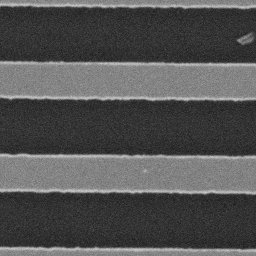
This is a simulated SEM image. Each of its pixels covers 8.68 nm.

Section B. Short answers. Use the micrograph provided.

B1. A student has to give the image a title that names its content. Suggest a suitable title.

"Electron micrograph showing lines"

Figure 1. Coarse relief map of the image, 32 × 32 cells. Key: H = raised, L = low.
HHHHHHHHHHHHHHHHHHHHHHHHHHHHHHHH
LLLLLLLLLLLLLLLLLLLLLLLLLLLLLLLL
LLLLLLLLLLLLLLLLLLLLLLLLLLLLLLLL
LLLLLLLLLLLLLLLLLLLLLLLLLLLLLLLL
LLLLLLLLLLLLLLLLLLLLLLLLLLLLLLLL
LLLLLLLLLLLLLLLLLLLLLLLLLLLLLLLL
LLLLLLLLLLLLLLLLLLLLLLLLLLLLLLLL
LLLLLLLLLLLLLLLLLLLLLLLLLLLLLLLL
HHHHHHHHHHHHHHHHHHHHHHHHHHHHHHHH
HHHHHHHHHHHHHHHHHHHHHHHHHHHHHHHH
HHHHHHHHHHHHHHHHHHHHHHHHHHHHHHHH
HHHHHHHHHHHHHHHHHHHHHHHHHHHHHHHH
LLLLLLLLLLLLLLLLLLLLLLLLLLLLLHLL
LLLLLLLLLLLLLLLLLLLLLLLLLLLLLLLL
LLLLLLLLLLLLLLLLLLLLLLLLLLLLLLLL
LLLLLLLLLLLLLLLLLLLLLLLLLLLLLLLL
LLLLLLLLLLLLLLLLLLLLLLLLLLLLLLLL
LLLLLLLLLLLLLLLLLLLLLLLLLLLLLLLL
LLLLLLLLLLLLLLLLLLLLLLLLLLLLLLLL
HHHHHHHHHHHHHHHHLLLHHLLLLLLLLLLL
HHHHHHHHHHHHHHHHHHHHHHHHHHHHHHHH
HHHHHHHHHHHHHHHHHHHHHHHHHHHHHHHH
HHHHHHHHHHHHHHHHHHHHHHHHHHHHHHHH
HHHHHHHHHHHHHHHHHHHHHHHHHHHHHHHH
LLLLLLLLLLLLLLLLLLLLLLLLLLLLLLLL
LLLLLLLLLLLLLLLLLLLLLLLLLLLLLLLL
LLLLLLLLLLLLLLLLLLLLLLLLLLLLLLLL
LLLLLLLLLLLLLLLLLLLLLLLLLLLLLLLL
LLLLLLLLLLLLLLLLLLLLLLLLLLLLLLLL
LLLLLLLLLLLLLLLLLLLLLLLLLLLLLLLL
LLLLLLLLLLLLLLLLLLLLLLLLLLLLLLLL
HHHHHHHHHHHHHHHHHHHHHHHHHHHHHHHH